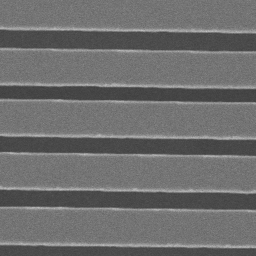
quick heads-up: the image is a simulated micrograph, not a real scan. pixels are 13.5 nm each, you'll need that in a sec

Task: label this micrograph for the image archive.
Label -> lines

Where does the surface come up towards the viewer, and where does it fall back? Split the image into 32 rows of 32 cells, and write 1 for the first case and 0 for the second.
11111111111111111111111111111111
11111111111111111111111111111111
11111111111111111111111111111111
11111111111111111111111111111111
00000000000000000000000000000000
00000000000000000000000000000000
11111111111111111111111110000000
11111111111111111111111111111111
11111111111111111111111111111111
11111111111111111111111111111111
11111111111111111111111111111111
00000000000000000000000000000000
11000000000000000000000000000000
11111111111111111111111111111111
11111111111111111111111111111111
11111111111111111111111111111111
11111111111111111111111111111111
00000000000000000000000000000000
00000000000000000000000000000000
11111111111111111111111111111100
11111111111111111111111111111111
11111111111111111111111111111111
11111111111111111111111111111111
11111111111111111111111111111111
00000000000000000000000000000000
00000000000000000000000000000000
11111111111111111111111111111111
11111111111111111111111111111111
11111111111111111111111111111111
11111111111111111111111111111111
11111111111111111111111111111111
00000000000000000000000000000000